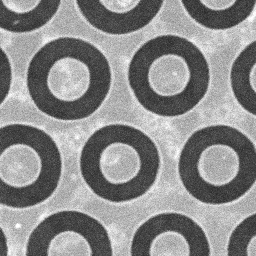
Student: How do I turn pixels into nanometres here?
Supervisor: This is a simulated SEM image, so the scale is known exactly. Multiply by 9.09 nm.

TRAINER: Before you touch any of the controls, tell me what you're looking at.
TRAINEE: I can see ring-shaped grooves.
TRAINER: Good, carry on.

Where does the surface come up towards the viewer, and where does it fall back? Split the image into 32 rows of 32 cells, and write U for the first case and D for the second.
DUUUUDDUUUDDDUUUUDDDUUUDDUUUUDDD
DDUDDDDUUUDDDDUDDDDDUUUDDDDDDDDU
DDDDDDUUUUUDDDDDDDDUUUUUDDDDDDDU
DDDDDUUUUUUUDDDDDDUUUUUUUUDDDUUU
UUUUUUUUUUUUUUUUUUUUDDUUUUUUUUUU
UUUUUUDDDDDUUUUUUUDDDDDDUUUUUUUD
DUUUUDDDDDDDDUUUUDDDDDDDDUUUUUDD
DUUUDDDDUDDDDUUUDDDDUUUDDDUUUDDD
DUUDDDUUUUUDDDUUDDDUUUUDDDUUUDDD
DDUDDDUUUUUDDDUUDDDUUUUUDDUUUDDU
DUUDDDUUUUUDDDUUDDDUUUUDDDUUUDDU
DUUUDDUUUUUDDDUUUDDDUUUDDDUUUDDD
DUUUDDDDUDDDDUUUUDDDDDDDDUUUUUDD
UUUUUDDDDDDDUUUUUUDDDDDDUUUUUUDD
UUUUUUDDDDDUUUUUUUUUDDUUUUUUUUUU
UUUUUUUUUUUUUUDUUUUUUUUUUUUUUUUU
DDDDDDUUUUUUDDDDDDUUUUUUDDDDDDUU
DDDDDDDUUUUDDDDDDDDUUUUDDDDDDDDU
DUUUDDDUUUDDDUUUUDDDUUUDDDUUUDDD
UUUUUDDDUUDDDUUUUDDDUUDDDUUUUUDD
UUUUUDDDUUDDDUUUUDDDUUDDDUUUUUDD
UUUUUDDDUUDDDUUUUDDDUUDDDUUUUUDD
UUUUDDDUUUUDDDUUDDDDUUUDDDUUUDDD
DDDDDDDUUUUDDDDDDDDUUUUDDDDDDDDU
DDDDDDUUUUUUDDDDDDUUUUUUDDDDDDUU
DDDDDUUUUUUUUUUUUUUUUUUUUUDUUUUU
UUUUUUUDDDUUUUUUUUUUUUUUUUUUUUUU
UUUUUDDDDDDDUUUUUUDDDDDDUUUUUUDD
UUUUDDDDDDDDDUUUUDDDDDDDDUUUUDDD
DUUUDDDUUUDDDDUUUDDDUUUDDDUUUDDD
DUUDDDUUUUUDDDUUDDDUUUUDDDUUUDDU
DUUDDDUUUUUDDDUUDDDUUUUUDDUUDDDU